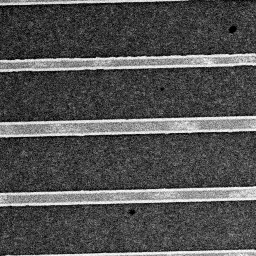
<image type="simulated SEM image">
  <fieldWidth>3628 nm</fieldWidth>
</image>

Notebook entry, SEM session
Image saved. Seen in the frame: one or a few lines or trenches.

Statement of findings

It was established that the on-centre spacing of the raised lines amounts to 0.948 micrometres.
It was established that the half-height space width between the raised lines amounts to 754 nm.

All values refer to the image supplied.